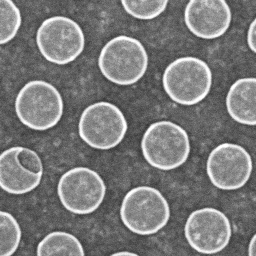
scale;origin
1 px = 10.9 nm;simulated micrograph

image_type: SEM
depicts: a regular array of raised bodies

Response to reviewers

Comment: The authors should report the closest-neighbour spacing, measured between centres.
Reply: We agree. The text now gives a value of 0.726 um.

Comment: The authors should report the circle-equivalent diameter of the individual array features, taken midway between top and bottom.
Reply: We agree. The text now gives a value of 497 nm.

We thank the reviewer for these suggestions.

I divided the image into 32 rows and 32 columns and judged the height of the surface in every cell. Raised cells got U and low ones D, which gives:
UUDDDDDDDDDDDDDUUUUUUDDDUUUUDDDD
UUDDDDDDDDDDDDDDUUUUDDDUUUUUUDDD
UUDDDDUUUDDDDDDDDDDDDDDUUUUUUDDD
UUDDDUUUUUDDDDDDDDDDDDDDUUUUDDDU
UUDDDUUUUUDDDDDDDDDDDDDDDUUDDDDU
DDDDDUUUUUDDDDUUUDDDDDDDDDDDDDDU
DDDDDUUUUUDDDUUUUUDDDDDDDDDDDDDD
DDDDDDUUUDDDDUUUUUDDDDUUUDDDDDDD
DDDDDDDDDDDDDUUUUUDDDUUUUUDDDDDD
DDDDDDDDDDDDDUUUUUDDDUUUUUDDDDDD
DDDDUUDDDDDDDDDDDDDDDUUUUUDDDUUU
DDDUUUUDDDDDDDDDDDDDDUUUUUDDDUUU
DDUUUUUUDDDDDDDDDDDDDDUUUDDDUUUU
DDUUUUUUDDDUUUDDDDDDDDDDDDDDDUUU
DDUUUUUDDDUUUUUDDDDDDDDDDDDDDUUU
DDDUUUUDDDUUUUUUDDDDUUDDDDDDDDDD
DDDDDDDDDDUUUUUUDDUUUUUDDDDDDDDD
DDDDDDDDDDDUUUUDDDUUUUUDDDDDDDDD
DDDDDDDDDDDDDDDDDDUUUUUUDDDUUUDD
UUDDDDDDDDDDDDDDDDUUUUUDDDUUUUUD
UUUDDDDDDDDDDDDDDDDUUUDDDDUUUUUD
UUUUDDDDDUUUDDDDDDDDDDDDDDUUUUUD
UUUUUDDDUUUUUDDDDDDDDDDDDDDUUUUD
UUUUDDDUUUUUUDDDDUDDDDDDDDDDUDDD
DDDDDDDDUUUUUDDDUUUUDDDDDDDDDDDD
DDDDDDDDUUUUDDDUUUUUUDDDDDDDDDDD
DDDDDDDDDDUDDDDUUUUUUDDDUUUDDDDD
UUDDDDDDDDDDDDDUUUUUUDDDUUUUDDDD
UUDDDDDDDDDDDDDDUUUUDDDUUUUUUDDD
UUDDDDUUUDDDDDDDDDDDDDDUUUUUUDDD
UUDDDUUUUUDDDDDDDDDDDDDDUUUUDDDU
UDDDDUUUUUDDDDDDDDDDDDDDDUUDDDDU